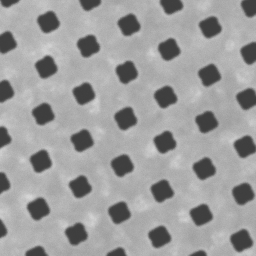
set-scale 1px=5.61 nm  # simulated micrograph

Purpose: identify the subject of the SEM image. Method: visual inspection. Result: a regular array of holes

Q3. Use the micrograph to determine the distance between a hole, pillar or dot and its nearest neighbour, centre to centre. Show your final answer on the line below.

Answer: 258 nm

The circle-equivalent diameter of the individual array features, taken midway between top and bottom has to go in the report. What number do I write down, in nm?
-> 121